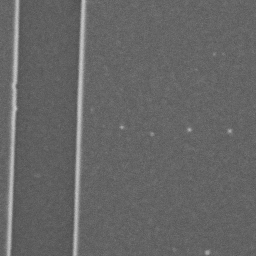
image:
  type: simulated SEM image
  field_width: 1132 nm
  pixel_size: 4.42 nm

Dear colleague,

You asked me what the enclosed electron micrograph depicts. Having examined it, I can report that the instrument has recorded one or a few lines or trenches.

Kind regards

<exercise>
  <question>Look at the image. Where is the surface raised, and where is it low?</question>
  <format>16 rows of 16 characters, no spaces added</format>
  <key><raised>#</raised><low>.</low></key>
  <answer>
#....###########
#....###########
#....###########
#....###########
#....###########
#....###########
#....###########
#....###########
#....###########
#....###########
#....###########
#....###########
#....###########
#....###########
#....###########
#....###########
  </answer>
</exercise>